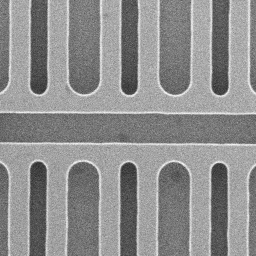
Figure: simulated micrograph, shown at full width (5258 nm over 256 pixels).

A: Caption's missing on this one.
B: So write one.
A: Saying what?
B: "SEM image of groups of lines, slits or small figures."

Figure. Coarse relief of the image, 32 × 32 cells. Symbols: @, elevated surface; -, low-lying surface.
-@@@--@@@----@@--@@@----@@---@@-
-@@@--@@@----@@--@@@----@@---@@-
-@@@--@@@----@@--@@@----@@---@@-
-@@@--@@@----@@--@@@----@@---@@-
-@@@--@@@----@@--@@@----@@---@@-
-@@@--@@-----@@--@@@----@@---@@-
-@@@--@@-----@@--@@@----@@---@@-
-@@@--@@-----@@--@@@----@@---@@-
-@@@--@@@----@@--@@@----@@---@@-
-@@@--@@@----@@--@@@----@@---@@-
-@@@--@@@---@@@--@@@----@@---@@-
@@@@--@@@---@@@--@@@@--@@@@-@@@@
@@@@@@@@@@@@@@@@@@@@@@@@@@@@@@@@
@@@@@@@@@@@@@@@@@@@@@@@@@@@@@@@@
--------------------------------
--------------------------------
--------------------------------
--------------------------------
@@@@@@@@@@@@@@@@@@@@@@@@@@@@@@@@
@@@@@@@@@@@@@@@@@@@@@@@@@@@@@@@@
@@@@-@@@@--@@@@@-@@@@--@@@@-@@@@
-@@@--@@@---@@@--@@@----@@--@@@-
-@@@--@@----@@@--@@@----@@---@@-
-@@@--@@----@@@--@@@----@@---@@-
-@@@--@@----@@@--@@@----@@---@@-
-@@@--@@----@@@--@@@----@@---@@-
-@@@--@@----@@@--@@@----@@---@@-
-@@@--@@----@@@--@@@----@@---@@-
-@@@--@@----@@@--@@@----@@--@@@-
-@@@--@@----@@@--@@@----@@--@@@-
-@@@--@@----@@@--@@@----@@---@@-
-@@@--@@----@@@--@@@----@@---@@-